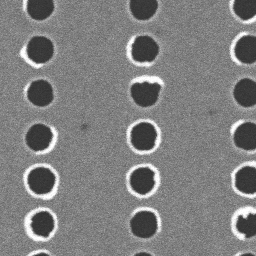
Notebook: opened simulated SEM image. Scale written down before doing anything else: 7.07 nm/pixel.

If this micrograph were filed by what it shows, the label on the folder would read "a regular array of holes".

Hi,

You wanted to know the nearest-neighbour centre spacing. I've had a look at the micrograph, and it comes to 308 nm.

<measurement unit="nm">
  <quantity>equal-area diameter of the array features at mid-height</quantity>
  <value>196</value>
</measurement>